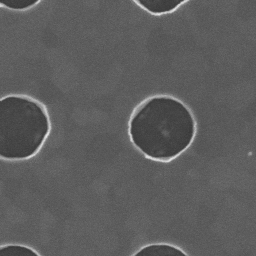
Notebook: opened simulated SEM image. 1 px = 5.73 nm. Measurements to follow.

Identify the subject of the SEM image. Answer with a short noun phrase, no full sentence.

holes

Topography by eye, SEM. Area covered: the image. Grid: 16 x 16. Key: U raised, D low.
UUUUUUUUUDDUUUUU
UUUUUUUUUUUUUUUU
UUUUUUUUUUUUUUUU
UUUUUUUUUUUUUUUU
UUUUUUUUUUUUUUUU
UUUUUUUUUUUUUUUU
DDUUUUUUUDDUUUUU
DDDUUUUUDDDDUUUU
DDDUUUUUDDDDUUUU
DDUUUUUUUDDUUUUU
UUUUUUUUUUUUUUUU
UUUUUUUUUUUUUUUU
UUUUUUUUUUUUUUUU
UUUUUUUUUUUUUUUU
UUUUUUUUUUUUUUUU
DDUUUUUUUDDUUUUU